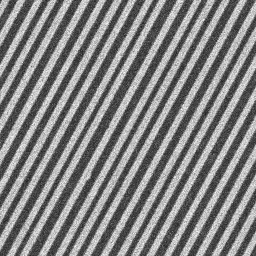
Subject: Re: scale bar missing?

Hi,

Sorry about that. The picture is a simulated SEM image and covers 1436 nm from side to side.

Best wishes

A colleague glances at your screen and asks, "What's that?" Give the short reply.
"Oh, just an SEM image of parallel lines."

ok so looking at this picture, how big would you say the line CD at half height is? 36.3 nm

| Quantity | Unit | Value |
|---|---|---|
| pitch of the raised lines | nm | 77.7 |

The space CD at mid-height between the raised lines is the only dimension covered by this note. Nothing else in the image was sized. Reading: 46.2 nm